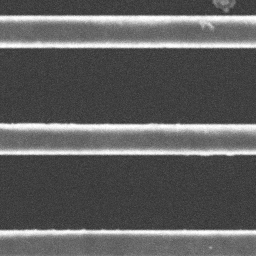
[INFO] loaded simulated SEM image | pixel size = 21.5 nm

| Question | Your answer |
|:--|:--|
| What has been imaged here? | lines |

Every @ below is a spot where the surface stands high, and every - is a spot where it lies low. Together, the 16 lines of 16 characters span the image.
----------------
@@@@@@@@@@@@@@@@
@@@@@@@@@@@@@@@@
----------------
----------------
----------------
----------------
----------------
@@@@@@@@@@@@@@@@
@@@@@@@@@@@@@@@@
----------------
----------------
----------------
----------------
@@@@@@@@@@@@@@@@
@@@@@@@@@@@@@@@@